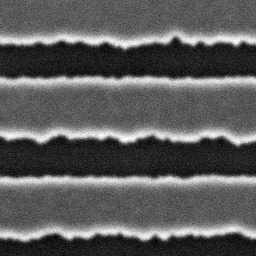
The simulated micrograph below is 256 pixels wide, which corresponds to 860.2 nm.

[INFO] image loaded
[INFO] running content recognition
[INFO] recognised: lines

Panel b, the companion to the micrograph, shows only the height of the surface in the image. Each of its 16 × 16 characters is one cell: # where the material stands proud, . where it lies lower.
################
################
################
................
................
################
################
################
###.#####.######
................
................
################
################
################
################
................